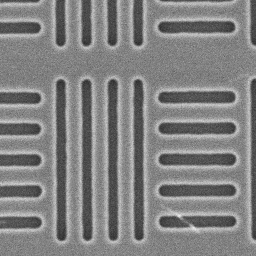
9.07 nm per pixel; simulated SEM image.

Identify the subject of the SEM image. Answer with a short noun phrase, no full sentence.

groups of lines, slits or small figures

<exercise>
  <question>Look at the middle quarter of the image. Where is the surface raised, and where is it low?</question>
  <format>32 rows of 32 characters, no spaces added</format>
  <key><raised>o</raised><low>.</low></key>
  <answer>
oooooooooooooooooooooooooooooooo
oooooooooooooooooooooooooooooooo
oooooooooooooooooooooooooooooooo
oooooooooooooooooooooooooooooooo
ooooo..oooo..oooo...oooooooooooo
.ooo...oooo...ooo...oooooooooooo
.ooo...oooo...ooo...oooooooooooo
.ooo...oooo...ooo...oooo........
.ooo...oooo...ooo...ooo.........
.ooo...oooo..oooo...oooo........
.ooo...oooo..oooo...oooooooooooo
.ooo...oooo..oooo...oooooooooooo
.ooo...oooo..oooo...oooooooooooo
.oooo..oooo...ooo...oooooooooooo
.oooo..oooo..oooo...oooooooooooo
.ooo...oooo..oooo...oooo........
.ooo...oooo..oooo...oooo........
.ooo...oooo...ooo...ooooo.......
.ooo...oooo...ooo...oooooooooooo
.ooo...oooo...ooo...oooooooooooo
.ooo...oooo...ooo...oooooooooooo
.ooo...oooo...ooo...oooooooooooo
.ooo...oooo...ooo...ooooo.......
.ooo...oooo...ooo...oooo........
.ooo...oooo..oooo...oooo........
.ooo...oooo..oooo...oooooooooooo
.ooo...oooo...ooo...oooooooooooo
.ooo...oooo...ooo...oooooooooooo
.ooo...oooo...ooo...oooooooooooo
.ooo...oooo...ooo...oooooooooooo
.ooo...oooo...ooo...oooo........
.ooo...oooo...ooo...oooo........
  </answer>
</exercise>